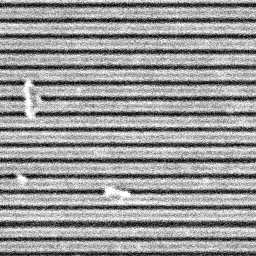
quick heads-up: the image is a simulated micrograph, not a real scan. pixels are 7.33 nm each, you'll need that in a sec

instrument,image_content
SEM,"parallel lines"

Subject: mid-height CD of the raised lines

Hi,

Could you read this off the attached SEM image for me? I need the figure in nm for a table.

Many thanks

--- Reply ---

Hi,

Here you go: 69.7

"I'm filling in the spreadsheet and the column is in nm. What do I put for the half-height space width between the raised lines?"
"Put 44.9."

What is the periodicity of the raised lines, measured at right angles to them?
114 nm